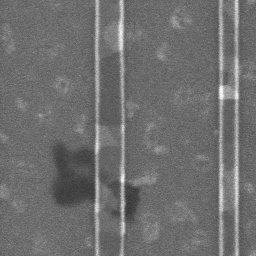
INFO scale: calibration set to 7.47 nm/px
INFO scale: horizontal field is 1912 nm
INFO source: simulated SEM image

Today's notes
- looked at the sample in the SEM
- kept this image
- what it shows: one or a few lines or trenches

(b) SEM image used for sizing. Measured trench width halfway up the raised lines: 730 nanometres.